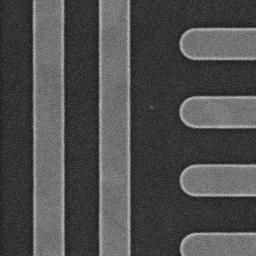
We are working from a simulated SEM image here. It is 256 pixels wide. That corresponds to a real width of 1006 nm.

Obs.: groups of lines, slits or small figures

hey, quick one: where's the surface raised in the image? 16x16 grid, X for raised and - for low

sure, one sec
--XX--XX--------
--XX--XX--------
--XX--XX---XXXXX
--XX--XX----XXXX
--XX--XX--------
--XX--XX--------
--XX--XX----XXXX
--XX--XX---XXXXX
--XX--XX--------
--XX--XX--------
--XX--XX----XXXX
--XX--XX---XXXXX
--XX--XX--------
--XX--XX--------
--XX--XX--------
--XX--XX---XXXXX